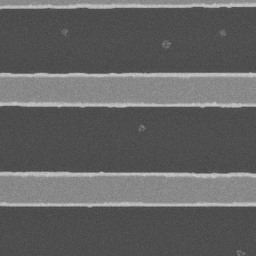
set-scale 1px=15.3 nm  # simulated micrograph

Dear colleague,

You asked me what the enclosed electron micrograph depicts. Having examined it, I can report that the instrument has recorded lines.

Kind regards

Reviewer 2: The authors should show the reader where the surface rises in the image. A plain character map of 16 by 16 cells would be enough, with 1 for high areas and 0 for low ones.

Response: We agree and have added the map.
1111111000000000
0000000000000000
0000000000000000
0000000000000000
0000000000000000
1111111111111111
1111111111111111
0000000000000000
0000000000000000
0000000000000000
0000000000000000
1111111111111111
1111111111111111
0000000000000000
0000000000000000
0000000000000000